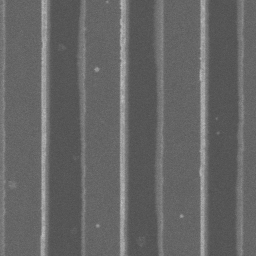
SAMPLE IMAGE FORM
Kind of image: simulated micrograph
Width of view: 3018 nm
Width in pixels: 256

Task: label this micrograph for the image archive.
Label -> lines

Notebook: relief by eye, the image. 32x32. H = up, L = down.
HHHHHHLLLLLHHHHHLLLLHHHHHHLLLLHH
HHHHHHLLLLLHHHHHLLLLHHHHHHLLLLHH
HHHHHHLLLLHHHHHHLLLLHHHHHHLLLLHH
HHHHHHLLLLHHHHHHLLLLHHHHHHLLLLHH
HHHHHHLLLLHHHHHHLLLLHHHHHHLLLLHH
HHHHHHLLLLHHHHHHLLLLHHHHHHLLLLHH
HHHHHHLLLLHHHHHHLLLLHHHHHHLLLLHH
HHHHHHLLLLHHHHHHLLLLHHHHHHLLLLHH
HHHHHHLLLLHHHHHHLLLLHHHHHHLLLLHH
HHHHHHLLLLHHHHHHLLLLHHHHHHLLLLHH
HHHHHHLLLLHHHHHHLLLLHHHHHHLLLLHH
HHHHHHLLLLHHHHHHLLLLHHHHHHLLLLHH
HHHHHHLLLLLHHHHHLLLLHHHHHHLLLLHH
HHHHHHLLLLLHHHHHLLLLHHHHHHLLLLHH
HHHHHHLLLLHHHHHHLLLLHHHHHHLLLLHH
HHHHHHLLLLHHHHHHLLLLHHHHHHLLLLHH
HHHHHHLLLLLHHHHHLLLLHHHHHHLLLLHH
HHHHHHLLLLLHHHHHLLLLHHHHHHLLLLHH
HHHHHHLLLLLHHHHHLLLLHHHHHHLLLLHH
HHHHHHLLLLHHHHHHLLLLHHHHHHLLLLHH
HHHHHHLLLLHHHHHHLLLLHHHHHHLLLLHH
HHHHHHLLLLLHHHHHLLLLHHHHHHLLLLHH
HHHHHHLLLLLHHHHHLLLLHHHHHHLLLLHH
HHHHHHLLLLLHHHHHLLLLHHHHHHLLLLHH
HHHHHHLLLLLHHHHHLLLLHHHHHHLLLLHH
HHHHHHLLLLLHHHHHLLLLHHHHHHLLLLHH
HHHHHHLLLLLHHHHHLLLLHHHHHHLLLLHH
HHHHHHLLLLLHHHHHLLLLHHHHHHLLLLHH
HHHHHHLLLLLHHHHHLLLLHHHHHHLLLLHH
HHHHHHLLLLLHHHHHLLLLHHHHHHLLLLHH
HHHHHHLLLLLHHHHHLLLLHHHHHHLLLLHH
HHHHHHLLLLLHHHHHLLLLHHHHHHLLLLHH